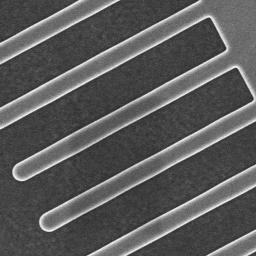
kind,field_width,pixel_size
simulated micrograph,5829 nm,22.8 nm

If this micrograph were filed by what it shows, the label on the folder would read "groups of lines, slits or small figures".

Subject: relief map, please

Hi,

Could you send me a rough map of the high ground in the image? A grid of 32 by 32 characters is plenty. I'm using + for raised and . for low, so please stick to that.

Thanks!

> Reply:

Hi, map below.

.........+++++..........++++++++
.......+++++..........++++++++++
.....+++++..........+++++.++++++
....++++...........++++....+++++
..+++++..........+++++......++++
+++++..........+++++........++++
+++..........+++++..........++++
+..........+++++..........++++++
.........+++++..........++++++++
.......+++++..........+++++...++
......++++...........++++......+
....+++++..........+++++.......+
..+++++..........+++++..........
+++++..........+++++..........++
+++..........+++++..........++++
+..........+++++..........+++++.
.........+++++...........++++...
........+++++..........++++.....
......+++++..........+++++......
....+++++..........+++++........
..+++++..........+++++..........
..+++..........+++++..........++
.............+++++..........++++
............++++...........++++.
..........+++++..........+++++..
........+++++..........+++++....
......+++++..........+++++......
.....++++..........+++++........
.....++..........+++++..........
................++++...........+
..............++++...........+++
............+++++..........+++++